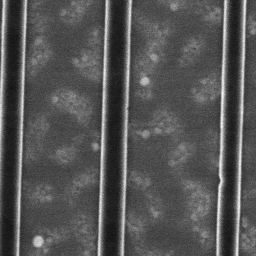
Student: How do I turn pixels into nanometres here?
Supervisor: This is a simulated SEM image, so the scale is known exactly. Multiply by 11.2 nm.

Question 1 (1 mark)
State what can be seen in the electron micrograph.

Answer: one or a few lines or trenches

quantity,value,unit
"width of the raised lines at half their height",253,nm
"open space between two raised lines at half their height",980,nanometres